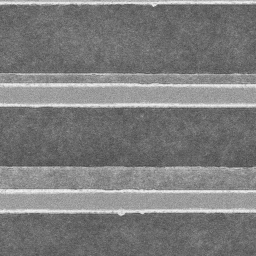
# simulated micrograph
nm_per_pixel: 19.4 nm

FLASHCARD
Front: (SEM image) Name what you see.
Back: lines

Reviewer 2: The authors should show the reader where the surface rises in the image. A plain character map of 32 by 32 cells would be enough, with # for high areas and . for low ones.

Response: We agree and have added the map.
..................##............
................................
................................
................................
................................
................................
................................
................................
................................
################################
################################
################################
################################
................................
................................
................................
................................
................................
................................
................................
................................
################################
################################
################################
################################
################################
################################
................................
................................
................................
................................
................................